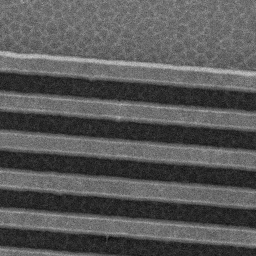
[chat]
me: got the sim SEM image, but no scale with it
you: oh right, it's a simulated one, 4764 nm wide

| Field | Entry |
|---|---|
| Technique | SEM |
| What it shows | parallel lines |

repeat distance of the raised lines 0.722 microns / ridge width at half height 322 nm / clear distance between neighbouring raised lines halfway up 21.9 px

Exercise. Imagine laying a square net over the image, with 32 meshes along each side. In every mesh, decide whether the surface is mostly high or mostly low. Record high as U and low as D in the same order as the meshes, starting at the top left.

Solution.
DDDDDDDDDDDDDDDDDDDDDDDDDDDDDDDD
DDDDDDDDDDDDDDDDDDDDDDDDDDDDDDDD
DDDDDDDDDDDDDDDDDDDDDDDDDDDDDDDD
DDDDDDDDDDDDDDDDDDDDDDDDDDDDDDDD
DDDDDDDDDDDDDDDDDDDDDDDDDDDDDDDD
DDDDDDDDDDDDDDDDDDDDDDDDDDDDDDDD
DDDDDDDDDDDDDDDDDDDDDDDDDDDDDDDD
UUUUUUUUUUDDDDDDDDDDDDDDDDDDDDDD
UUUUUUUUUUUUUUUUUUUUUUUDDDDDDDDD
DDDDDDDDDUUUUUUUUUUUUUUUUUUUUUUU
DDDDDDDDDDDDDDDDDDDDDDUUUUUUUUUU
DDDDDDDDDDDDDDDDDDDDDDDDDDDDDDDD
UUUUUUUUUUUDDDDDDDDDDDDDDDDDDDDD
UUUUUUUUUUUUUUUUUUUUUUUUDDDDDDDD
DDDDDDDDDDUUUUUUUUUUUUUUUUUUUUUU
DDDDDDDDDDDDDDDDDDDDDDDUUUUUUUUU
UDDDDDDDDDDDDDDDDDDDDDDDDDDDDDDD
UUUUUUUUUUUUUUDDDDDDDDDDDDDDDDDD
UUUUUUUUUUUUUUUUUUUUUUUUUUDDDDDD
DDDDDDDDDDDDUUUUUUUUUUUUUUUUUUUU
DDDDDDDDDDDDDDDDDDDDDDDDUUUUUUUU
UUUUDDDDDDDDDDDDDDDDDDDDDDDDDDDD
UUUUUUUUUUUUUUUUDDDDDDDDDDDDDDDD
DUUUUUUUUUUUUUUUUUUUUUUUUUUUDDDD
DDDDDDDDDDDDDUUUUUUUUUUUUUUUUUUU
DDDDDDDDDDDDDDDDDDDDDDDDDDUUUUUU
UUUUDDDDDDDDDDDDDDDDDDDDDDDDDDDD
UUUUUUUUUUUUUUUUUDDDDDDDDDDDDDDD
DDDUUUUUUUUUUUUUUUUUUUUUUUUUUDDD
DDDDDDDDDDDDDDDDUUUUUUUUUUUUUUUU
DDDDDDDDDDDDDDDDDDDDDDDDDDDDDUUU
UUUUUUUDDDDDDDDDDDDDDDDDDDDDDDDD